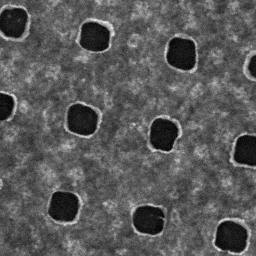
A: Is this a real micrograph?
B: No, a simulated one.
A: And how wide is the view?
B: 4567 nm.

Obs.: holes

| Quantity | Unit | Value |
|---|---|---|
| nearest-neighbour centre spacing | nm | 1490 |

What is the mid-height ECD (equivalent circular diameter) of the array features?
32.4 pixels